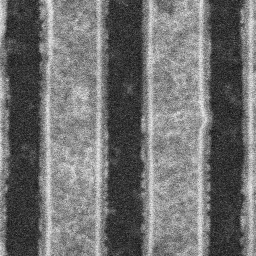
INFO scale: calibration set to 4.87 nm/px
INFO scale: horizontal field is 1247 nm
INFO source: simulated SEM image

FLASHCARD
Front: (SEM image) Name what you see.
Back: one or a few lines or trenches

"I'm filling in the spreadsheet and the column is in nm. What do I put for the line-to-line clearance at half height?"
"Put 247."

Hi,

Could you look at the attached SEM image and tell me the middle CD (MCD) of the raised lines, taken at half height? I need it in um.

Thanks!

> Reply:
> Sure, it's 0.242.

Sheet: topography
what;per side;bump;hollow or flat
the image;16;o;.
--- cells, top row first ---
...ooo...oooo...
...ooo...oooo...
...ooo...oooo...
...ooo...ooo....
...ooo...oooo...
...ooo...oooo...
...ooo...oooo...
...ooo...oooo...
...ooo...oooo...
...ooo...ooo....
...ooo...ooo....
...ooo...ooo....
...ooo...ooo....
...ooo...ooo....
...ooo...ooo....
...ooo...ooo....